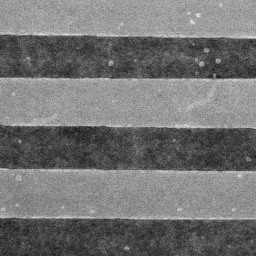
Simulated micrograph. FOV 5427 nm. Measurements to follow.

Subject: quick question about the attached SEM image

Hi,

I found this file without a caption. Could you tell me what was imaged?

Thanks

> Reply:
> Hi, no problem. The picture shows lines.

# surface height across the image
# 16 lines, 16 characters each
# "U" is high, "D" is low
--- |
UUUUUUUUUUUUUUUU
UUUUUUUUUUUUUUUU
DDDDDDDDDDDDDDDD
DDDDDDDDDDDDDDDD
DDDDDDDDDDDDDDDD
UUUUUUUUUUUUUUUU
UUUUUUUUUUUUUUUU
UUUUUUUUUUUUUUUU
DDDDDDDDDDDDDDDD
DDDDDDDDDDDDDDDD
DDDDDDDDDDDDDDDD
UUUUUUUUUUUUUUUU
UUUUUUUUUUUUUUUU
UUUUUUUUUUUUUUUU
DDDDDDDDDDDDDDDD
DDDDDDDDDDDDDDDD